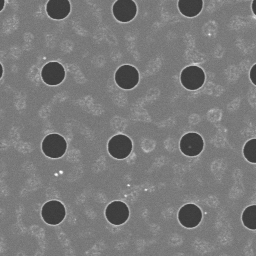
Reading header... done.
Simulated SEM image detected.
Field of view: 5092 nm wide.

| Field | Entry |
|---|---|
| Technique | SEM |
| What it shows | a regular array of holes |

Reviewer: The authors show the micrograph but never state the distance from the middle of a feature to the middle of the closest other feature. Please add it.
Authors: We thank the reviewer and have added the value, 1.31 micrometres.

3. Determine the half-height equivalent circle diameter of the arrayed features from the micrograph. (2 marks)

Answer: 484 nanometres